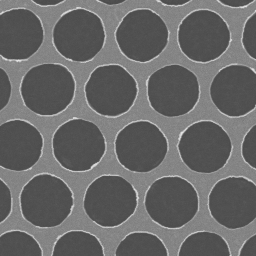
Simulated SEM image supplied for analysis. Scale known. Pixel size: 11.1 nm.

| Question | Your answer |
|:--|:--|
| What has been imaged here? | a regular array of holes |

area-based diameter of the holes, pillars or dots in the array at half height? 0.576 microns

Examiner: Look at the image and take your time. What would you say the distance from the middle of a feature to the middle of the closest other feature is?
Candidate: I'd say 691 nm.